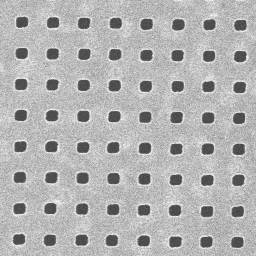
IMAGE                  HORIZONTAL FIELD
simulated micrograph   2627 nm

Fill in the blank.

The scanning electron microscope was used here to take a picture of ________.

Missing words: a regular array of holes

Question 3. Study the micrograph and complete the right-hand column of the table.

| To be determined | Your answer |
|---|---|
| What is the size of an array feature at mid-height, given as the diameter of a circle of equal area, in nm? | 132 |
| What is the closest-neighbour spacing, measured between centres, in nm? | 316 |